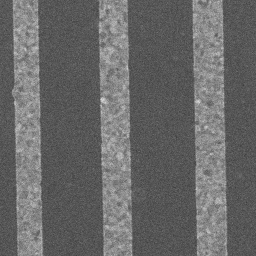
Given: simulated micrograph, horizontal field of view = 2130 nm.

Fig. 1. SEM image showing one or a few lines or trenches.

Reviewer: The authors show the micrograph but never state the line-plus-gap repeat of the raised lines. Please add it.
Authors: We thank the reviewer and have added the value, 758 nanometers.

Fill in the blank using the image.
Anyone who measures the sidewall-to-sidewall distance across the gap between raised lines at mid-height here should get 521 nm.